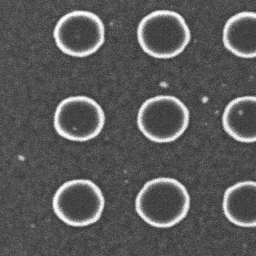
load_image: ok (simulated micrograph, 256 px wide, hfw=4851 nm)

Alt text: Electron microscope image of raised bodies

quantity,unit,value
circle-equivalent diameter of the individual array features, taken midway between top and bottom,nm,866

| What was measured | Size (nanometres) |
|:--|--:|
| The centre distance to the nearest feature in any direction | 1590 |